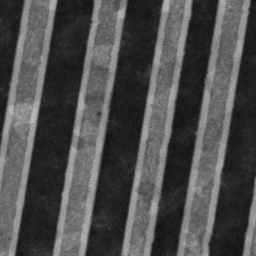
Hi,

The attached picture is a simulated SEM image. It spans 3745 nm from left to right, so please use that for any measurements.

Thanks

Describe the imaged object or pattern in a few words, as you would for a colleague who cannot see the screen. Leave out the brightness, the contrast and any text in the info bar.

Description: one or a few lines or trenches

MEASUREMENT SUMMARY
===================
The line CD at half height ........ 368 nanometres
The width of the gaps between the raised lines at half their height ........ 610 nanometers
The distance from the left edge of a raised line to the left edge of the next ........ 919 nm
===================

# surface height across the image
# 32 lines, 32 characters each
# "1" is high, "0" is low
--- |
00011110000011100000011100001110
00011110000011100000011100001110
00011100000011100000111000011110
00011100000011100000111000011100
00011100000011100000111000011100
00011100000111100000111000011100
00111100000111000000111000011100
00111100000111000000110000011100
00111000000111000001110000111100
00111000000111000001110000111000
00111000000111000001110000111000
00111000001111000001110000111000
01111000001110000001110000111000
01111000001110000001100000111000
01110000001110000011100001111000
01110000001110000011100001110000
01110000001110000011100001110000
01110000011110000011100001110000
11110000011100000011100001110000
11110000011100000011000001110000
11100000011100000111000011110000
11100000011100000111000011100000
11100000011100000111000011100000
11100000111100000111000011100000
11100000111000000111000011100000
11100000111000000110000011100000
11000000111000001110000111100000
11000000111000001110000111000001
11000000111000001110000111000001
11000001111000001110000111000001
11000001110000001110000111000001
11000001110000001100000111000001